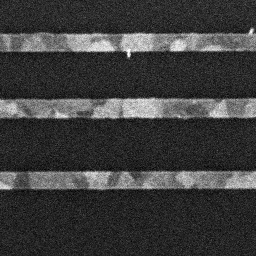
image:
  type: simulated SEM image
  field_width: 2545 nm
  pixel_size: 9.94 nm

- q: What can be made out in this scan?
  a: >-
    one or a few lines or trenches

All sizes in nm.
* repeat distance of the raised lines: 686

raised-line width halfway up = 159 nm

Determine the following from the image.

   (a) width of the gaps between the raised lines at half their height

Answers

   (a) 519 nanometers